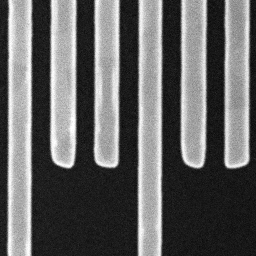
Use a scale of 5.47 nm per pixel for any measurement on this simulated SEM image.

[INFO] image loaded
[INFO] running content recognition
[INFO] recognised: wiring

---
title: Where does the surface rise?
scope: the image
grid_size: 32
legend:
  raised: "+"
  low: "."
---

.+++...++...+++..+++...+++..+++.
.+++...++...+++...++...+++..+++.
.+++...++...+++..+++...+++..+++.
.+++...++...+++..+++...+++..+++.
.+++...++...+++..+++...+++..+++.
.+++...++...+++..+++...+++..+++.
.+++...++...+++..+++...+++..+++.
.+++...++...+++..+++...+++..+++.
.+++...++...+++..+++...+++..+++.
.+++...++...+++..+++...+++..+++.
.+++...++...+++..+++...+++..+++.
.+++...++...+++..+++...+++..+++.
.+++...++...+++..+++...+++..+++.
.+++...++...+++..+++...+++..+++.
.+++...++...+++..+++...+++..+++.
.+++..+++...+++..+++...+++..+++.
.+++..+++...+++..+++...+++..+++.
.+++..+++...+++..+++...+++..+++.
.+++..+++...+++..+++...+++..+++.
.+++...++...+++..+++...+++..+++.
.+++...++...++...+++....+...+++.
.+++.............+++............
.+++.............+++............
.+++.............+++............
.+++.............+++............
.+++.............+++............
.+++.............+++............
.+++.............+++............
.+++.............+++............
.+++.............+++............
.+++.............+++............
.+++.............+++............